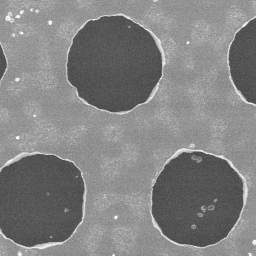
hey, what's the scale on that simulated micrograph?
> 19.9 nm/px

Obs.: holes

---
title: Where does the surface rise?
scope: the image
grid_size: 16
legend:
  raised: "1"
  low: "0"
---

1111111111111111
1111100001111110
1111100000111110
1111000000111100
1111000000111100
1111100000111110
1111110001111111
1111111111111111
1111111111111111
1111111111100111
0000011111000001
0000011111000001
0000011110000001
0000011111000001
0000011111000011
1111111111111111